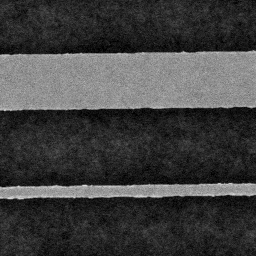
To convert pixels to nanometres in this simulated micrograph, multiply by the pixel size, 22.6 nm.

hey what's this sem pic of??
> lines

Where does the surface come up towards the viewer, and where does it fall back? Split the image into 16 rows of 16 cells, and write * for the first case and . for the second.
................
................
................
****************
****************
****************
****************
................
................
................
................
................
................
................
................
................